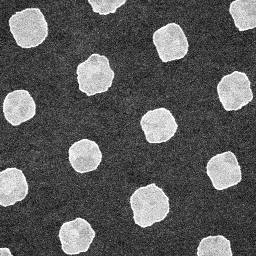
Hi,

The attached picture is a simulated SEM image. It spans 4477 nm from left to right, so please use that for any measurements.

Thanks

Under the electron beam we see a regular array of raised bodies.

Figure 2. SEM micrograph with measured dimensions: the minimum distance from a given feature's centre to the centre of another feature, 1400 nm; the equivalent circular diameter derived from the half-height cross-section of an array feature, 608 nm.